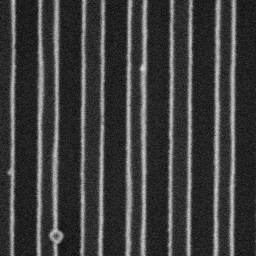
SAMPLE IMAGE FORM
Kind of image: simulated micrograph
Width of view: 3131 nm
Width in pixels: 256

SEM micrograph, lines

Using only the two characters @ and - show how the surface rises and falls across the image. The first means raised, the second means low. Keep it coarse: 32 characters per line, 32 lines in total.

@@---@@----@@---@@---@@@---@@---
@@---@@---@@@---@@---@@@---@@---
@@---@@----@@---@@---@@@---@@---
@@---@@---@@@---@@---@@@---@@---
@@---@@---@@@---@@---@@@---@@---
@@---@@---@@@---@@---@@@---@@---
@@---@@---@@@---@@---@@@---@@---
@@---@@---@@@---@@---@@@---@@---
@@---@@---@@@---@@---@@@---@@---
@@---@@---@@@---@@---@@@---@@---
@@---@@---@@@---@@---@@@---@@---
@@---@@---@@@---@@---@@@---@@---
@@---@@---@@@---@@---@@@---@@---
@@---@@---@@@---@@---@@@---@@---
@@---@@---@@@---@@---@@@---@@---
@@---@@---@@@---@@---@@@---@@---
@@---@@---@@@---@@---@@@---@@---
@@---@@---@@@---@@---@@@---@@---
@@---@@---@@@---@@---@@@---@@---
@@---@@---@@@---@@---@@@---@@---
@@---@@---@@@---@@---@@@---@@---
@@---@@---@@@---@@---@@@---@@---
@@---@@---@@@---@@---@@@---@@---
@@---@@---@@@---@@---@@@---@@---
@@---@@---@@@---@@---@@@---@@---
@----@@---@@@---@@---@@@---@@---
@----@@---@@@---@@---@@@---@@---
@----@@---@@@---@@---@@@---@@---
@----@@---@@@---@@---@@@---@@---
@----@@@--@@@---@@---@@@---@@---
@----@@---@@@---@@---@@@---@@---
@----@@---@@@---@@---@@@---@@---